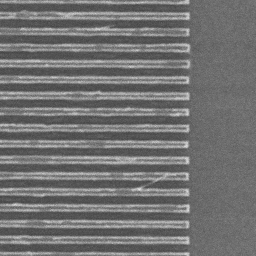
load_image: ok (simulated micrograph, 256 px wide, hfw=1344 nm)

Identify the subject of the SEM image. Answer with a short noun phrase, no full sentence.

parallel lines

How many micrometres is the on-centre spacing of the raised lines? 0.084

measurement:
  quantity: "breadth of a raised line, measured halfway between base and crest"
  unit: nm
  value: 35.4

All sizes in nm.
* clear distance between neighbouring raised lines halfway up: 48.5